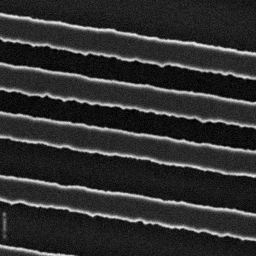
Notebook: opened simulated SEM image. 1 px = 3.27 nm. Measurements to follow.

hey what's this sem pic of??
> lines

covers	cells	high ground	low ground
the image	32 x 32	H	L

LLLLLLLLLLLLLLLLLLLLLLLLLLLLLLLL
LLLLLLLLLLLLLLLLLLLLLLLLLLLLLLLL
HHHHLLLLLLLLLLLLLLLLLLLLLLLLLLLL
HHHHHHHHHHHHLLLLLLLLLLLLLLLLLLLL
HHHHHHHHHHHHHHHHHHLLLLLLLLLLLLLL
LLLHHHHHHHHHHHHHHHHHHHHHHLLLLLLL
LLLLLLLLLHHHHHHHHHHHHHHHHHHHHHHL
LLLLLLLLLLLLLLLLHHHHHHHHHHHHHHHH
HHHHLLLLLLLLLLLLLLLLLLLHHHHHHHHH
HHHHHHHHHHHLLLLLLLLLLLLLLLLLLHHH
HHHHHHHHHHHHHHHHLLLLLLLLLLLLLLLL
LLHHHHHHHHHHHHHHHHHHHHHHLLLLLLLL
LLLLLLLLHHHHHHHHHHHHHHHHHHHHHHLL
LLLLLLLLLLLLLLLHHHHHHHHHHHHHHHHH
HHHHLLLLLLLLLLLLLLLLLLHHHHHHHHHH
HHHHHHHHHLLLLLLLLLLLLLLLLLLLLHHH
HHHHHHHHHHHHHHHHLLLLLLLLLLLLLLLL
LLHHHHHHHHHHHHHHHHHHHHHLLLLLLLLL
LLLLLLLLHHHHHHHHHHHHHHHHHHHHHLLL
LLLLLLLLLLLLLLLHHHHHHHHHHHHHHHHH
LLLLLLLLLLLLLLLLLLLLLHHHHHHHHHHH
LLLLLLLLLLLLLLLLLLLLLLLLLLLHHHHH
HHHHLLLLLLLLLLLLLLLLLLLLLLLLLLLL
HHHHHHHHHHHLLLLLLLLLLLLLLLLLLLLL
HHHHHHHHHHHHHHHHHHLLLLLLLLLLLLLL
LLLHHHHHHHHHHHHHHHHHHHHHLLLLLLLL
LLLLLLLLLHHHHHHHHHHHHHHHHHHHHHLL
LLLLLLLLLLLLLLLLHHHHHHHHHHHHHHHH
LLLLLLLLLLLLLLLLLLLLLLLHHHHHHHHH
LLLLLLLLLLLLLLLLLLLLLLLLLLLHHHHH
LLLLLLLLLLLLLLLLLLLLLLLLLLLLLLLL
HHHHHLLLLLLLLLLLLLLLLLLLLLLLLLLL